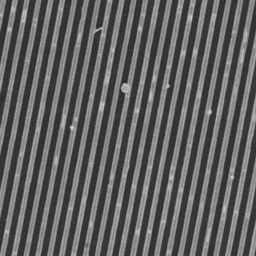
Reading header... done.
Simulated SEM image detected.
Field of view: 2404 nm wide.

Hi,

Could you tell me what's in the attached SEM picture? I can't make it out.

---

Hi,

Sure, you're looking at parallel lines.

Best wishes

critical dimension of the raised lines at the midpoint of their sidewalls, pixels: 4.66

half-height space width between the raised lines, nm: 69.1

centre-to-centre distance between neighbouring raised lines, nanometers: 110